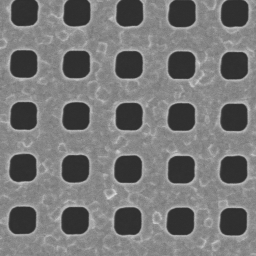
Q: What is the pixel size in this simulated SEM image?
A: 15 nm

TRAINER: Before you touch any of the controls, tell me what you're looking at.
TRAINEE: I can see a regular array of holes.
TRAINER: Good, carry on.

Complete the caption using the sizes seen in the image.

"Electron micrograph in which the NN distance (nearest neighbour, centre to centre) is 780 nm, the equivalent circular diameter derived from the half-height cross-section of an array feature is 29.6 px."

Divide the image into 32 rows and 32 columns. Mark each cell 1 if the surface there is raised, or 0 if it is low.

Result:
10000111000111100011100011110001
10000111000111000011100001110001
10000111000111100011100011110001
11111111111111111111111111111111
11111111111111111111111111111111
11111111111111111111111111111111
11001111000111100111110011111011
10000111000111000011100011110001
10000111000111000011100011110001
11001111000111100111100011110001
11111111111111111111111111111111
11111111111111111111111111111111
11111111111111111111111111111111
10000111000111100011100011110001
10000111000111000011100011110001
10000111000111000011100011110001
11111111111111111111111111111111
11111111111111111111111111111111
11111111111111111111111111111111
11001111000111100111110111111011
10000111000111000011100011110001
10000111000111000011100011110001
11001111000111100111100011110001
11111111111111111111111111111111
11111111111111111111111111111111
11111111111111111111111111111111
10001111000111100011100011110001
10000111000111000011100011100001
10001111000111000011100011100001
11111111111111111111111111111111
11111111111111111111111111111111
11111111111111111111111111111111